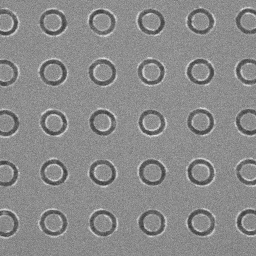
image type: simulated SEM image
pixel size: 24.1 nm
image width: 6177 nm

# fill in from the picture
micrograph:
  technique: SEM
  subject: a regular array of ring-shaped grooves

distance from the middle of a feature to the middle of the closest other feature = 1180 nm